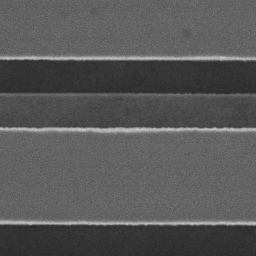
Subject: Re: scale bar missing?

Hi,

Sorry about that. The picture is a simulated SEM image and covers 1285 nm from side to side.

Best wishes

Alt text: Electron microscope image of lines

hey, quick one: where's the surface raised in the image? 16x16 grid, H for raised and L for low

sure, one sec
HHHHHHHHHHHHHHHH
HHHHHHHHHHHHHHHH
HHHHHHHHHHHHHHHH
HHHHHHHHHHHHHHHH
LLLLLLLLLLLLLLLL
LLLLLLLLLLLLLLLL
HHHHHHHHHHHHHHHH
HHHHHHHHHHHHHHHH
HHHHHHHHHHHHHHHH
HHHHHHHHHHHHHHHH
HHHHHHHHHHHHHHHH
HHHHHHHHHHHHHHHH
HHHHHHHHHHHHHHHH
HHHHHHHHHHHHHHHH
LLLLLLLLLLLLLLLL
LLLLLLLLLLLLLLLL